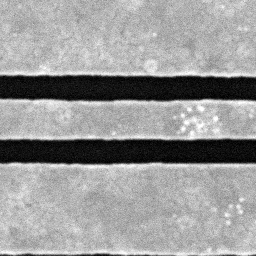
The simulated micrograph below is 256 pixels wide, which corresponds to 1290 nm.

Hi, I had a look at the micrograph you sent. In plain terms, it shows lines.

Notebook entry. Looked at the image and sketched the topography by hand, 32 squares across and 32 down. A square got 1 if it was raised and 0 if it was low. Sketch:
11111111111111111111111111111111
11111111111111111111111111111111
11111111111111111111111111111111
11111111111111111111111111111111
11111111111111111111111111111111
11111111111111111111111111111111
11111111111111111111111111111111
11111111111111111111111111111111
11111111111111111111111111111111
00000000000000000000000000001000
00000000000000000000000000000000
00000000000000000000000000000000
00000000000000000000000000000000
11111111111111111111111111111111
11111111111111111111111111111111
11111111111111111111111111111111
11111111111111111111111111111111
00000000000000000000000000000000
00000000000000000000000000000000
00000000000000000000000000000000
01111000000000000011100000000000
11111111111111111111111111111111
11111111111111111111111111111111
11111111111111111111111111111111
11111111111111111111111111111111
11111111111111111111111111111111
11111111111111111111111111111111
11111111111111111111111111111111
11111111111111111111111111111111
11111111111111111111111111111111
11111111111111111111111111111111
11111111111111111111111111111111